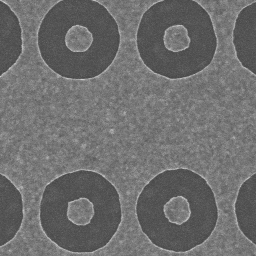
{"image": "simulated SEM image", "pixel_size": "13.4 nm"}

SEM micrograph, ring-shaped grooves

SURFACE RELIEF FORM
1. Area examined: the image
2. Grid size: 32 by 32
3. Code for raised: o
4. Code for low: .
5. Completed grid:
.oooooo......oooooo......oooooo.
..oooo........oooo........oooo..
..ooo.........oooo........ooo...
...oo....oo....oo....oo....oo...
...oo...ooo....oo....ooo...oo...
...oo...ooo....oo....ooo...oo...
...oo..........oo..........oo...
..ooo.........oooo.........ooo..
.ooooo.......oooooo.......ooooo.
oooooooo....oooooooo....oooooooo
oooooooooooooooooooooooooooooooo
oooooooooooooooooooooooooooooooo
oooooooooooooooooooooooooooooooo
oooooooooooooooooooooooooooooooo
oooooooooooooooooooooooooooooooo
oooooooooooooooooooooooooooooooo
oooooooooooooooooooooooooooooooo
oooooooooooooooooooooooooooooooo
oooooooooooooooooooooooooooooooo
oooooooooooooooooooooooooooooooo
oooooooooooooooooooooooooooooooo
ooooooooo...oooooooo....oooooooo
.oooooo......oooooo.......ooooo.
..oooo........oooo........oooo..
...oo..........oo..........ooo..
...oo....oo....oo....ooo...oo...
...oo...oooo...oo....ooo...oo...
...oo....oo....oo....oo....ooo..
..ooo..........ooo.........ooo..
..oooo........oooo........ooooo.
.oooooo......oooooo......ooooooo
ooooooooo..ooooooooooo.ooooooooo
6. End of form